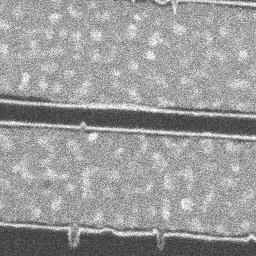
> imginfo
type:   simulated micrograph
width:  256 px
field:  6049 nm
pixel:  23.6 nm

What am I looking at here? one or a few lines or trenches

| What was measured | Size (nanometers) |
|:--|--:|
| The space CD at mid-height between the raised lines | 2410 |